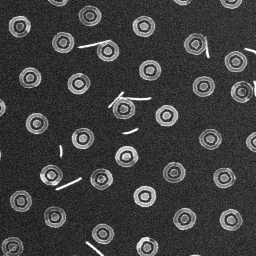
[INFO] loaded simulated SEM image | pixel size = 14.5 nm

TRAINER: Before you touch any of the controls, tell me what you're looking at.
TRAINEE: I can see a regular array of ring-shaped raised bodies with a dot in the middle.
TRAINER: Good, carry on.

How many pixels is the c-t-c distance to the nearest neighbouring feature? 41.3